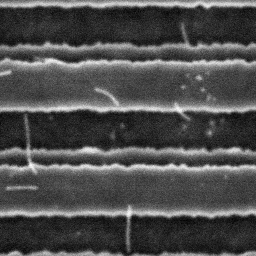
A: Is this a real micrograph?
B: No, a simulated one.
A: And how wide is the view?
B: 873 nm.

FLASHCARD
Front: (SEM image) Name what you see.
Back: lines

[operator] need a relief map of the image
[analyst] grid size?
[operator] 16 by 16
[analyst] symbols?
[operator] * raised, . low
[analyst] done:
................
................
................
................
****************
****************
****************
................
................
................
****************
****************
****************
................
................
................